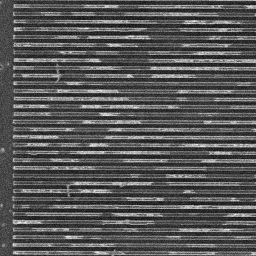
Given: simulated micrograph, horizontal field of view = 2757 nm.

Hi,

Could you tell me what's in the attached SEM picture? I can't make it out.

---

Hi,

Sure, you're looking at parallel lines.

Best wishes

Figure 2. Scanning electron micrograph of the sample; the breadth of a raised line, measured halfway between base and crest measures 33.7 nm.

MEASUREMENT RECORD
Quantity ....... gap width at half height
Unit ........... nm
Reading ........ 49.8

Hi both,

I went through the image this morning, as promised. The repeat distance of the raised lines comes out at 7.71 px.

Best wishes